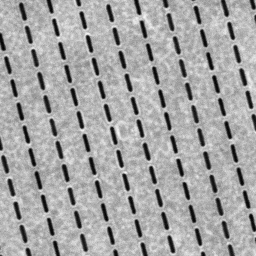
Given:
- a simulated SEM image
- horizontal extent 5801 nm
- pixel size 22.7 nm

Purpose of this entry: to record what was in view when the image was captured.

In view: a regular array of holes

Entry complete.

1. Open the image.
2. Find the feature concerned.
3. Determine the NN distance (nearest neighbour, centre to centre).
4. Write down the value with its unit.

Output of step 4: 0.538 microns